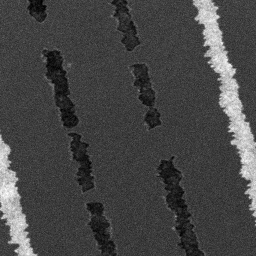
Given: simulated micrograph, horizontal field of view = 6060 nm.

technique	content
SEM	one or a few lines or trenches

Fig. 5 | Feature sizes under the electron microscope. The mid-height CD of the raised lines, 360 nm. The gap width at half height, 1530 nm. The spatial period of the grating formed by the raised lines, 1910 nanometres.